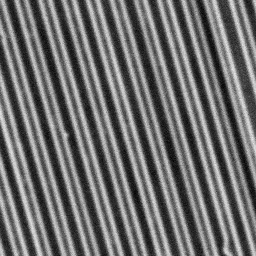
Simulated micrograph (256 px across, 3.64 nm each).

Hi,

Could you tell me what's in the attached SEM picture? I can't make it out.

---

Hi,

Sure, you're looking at parallel lines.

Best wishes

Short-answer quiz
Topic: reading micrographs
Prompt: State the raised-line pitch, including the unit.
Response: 0.0831 um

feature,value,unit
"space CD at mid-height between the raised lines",42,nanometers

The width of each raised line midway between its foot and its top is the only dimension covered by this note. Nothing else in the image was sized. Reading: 41.6 nm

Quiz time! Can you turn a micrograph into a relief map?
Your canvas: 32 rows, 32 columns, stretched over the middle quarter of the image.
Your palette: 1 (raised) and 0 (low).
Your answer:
10001110001110001110001110001110
11000111000111000111000110000110
11000111000111000111000111000111
11000111000111000111000111000111
11000111000111000111000111000111
11100011100011100011100011100011
11100011100011100011100011100011
11100011100011100011100011100011
01110001110001110001100001100011
01110001110001110001110001110001
01110001110001110001110001110001
01110001110001110001110001110001
00111000111000111000111000110000
00111000111000111000111000111000
00111000111000111000111000111000
00011100011000011000111000111000
00011100011100011100011100011000
00011100011100011100011100011100
00011100011100011100011100011100
10001110001110001110001110001100
10001110001110001110001110001110
10001110001110001110001110001110
11000110000110001110001110001110
11000111000111000111000111000110
11000111000111000111000111000111
11000111000111000111000111000111
11100011100011100011100011100011
11100011100011100011100011100011
11100011100011100011100011100011
01100011100011100011100011100011
01110001110001110001110001110001
01110001110001110001110001110001